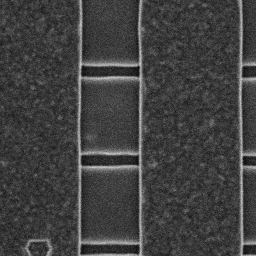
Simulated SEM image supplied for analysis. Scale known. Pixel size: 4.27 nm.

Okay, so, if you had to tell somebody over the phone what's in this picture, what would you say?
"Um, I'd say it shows wiring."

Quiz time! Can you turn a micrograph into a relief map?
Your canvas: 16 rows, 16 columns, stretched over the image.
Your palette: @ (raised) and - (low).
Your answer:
@@@@@----@@@@@@-
@@@@@----@@@@@@-
@@@@@----@@@@@@-
@@@@@----@@@@@@-
@@@@@----@@@@@@-
@@@@@----@@@@@@-
@@@@@----@@@@@@-
@@@@@----@@@@@@-
@@@@@----@@@@@@-
@@@@@----@@@@@@-
@@@@@----@@@@@@-
@@@@@----@@@@@@-
@@@@@----@@@@@@-
@@@@@----@@@@@@-
@@@@@----@@@@@@-
@@-@@----@@@@@@-